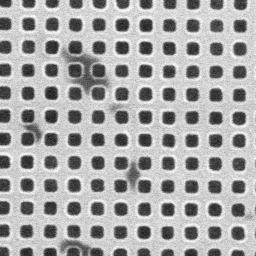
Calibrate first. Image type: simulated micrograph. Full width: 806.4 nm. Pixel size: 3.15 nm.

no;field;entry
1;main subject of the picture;a regular array of holes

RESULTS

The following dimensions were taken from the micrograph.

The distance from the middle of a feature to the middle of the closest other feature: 22.9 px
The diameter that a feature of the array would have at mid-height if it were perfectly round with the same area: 47.4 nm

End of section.